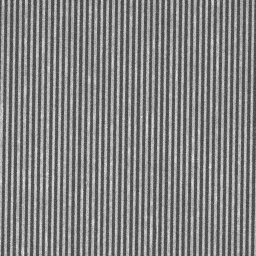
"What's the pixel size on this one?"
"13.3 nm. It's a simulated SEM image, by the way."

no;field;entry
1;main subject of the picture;parallel lines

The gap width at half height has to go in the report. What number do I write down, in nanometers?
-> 48.1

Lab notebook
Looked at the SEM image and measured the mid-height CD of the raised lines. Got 33.1 nanometers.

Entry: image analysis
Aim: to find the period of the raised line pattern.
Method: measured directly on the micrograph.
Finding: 77.1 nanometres